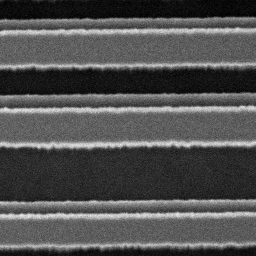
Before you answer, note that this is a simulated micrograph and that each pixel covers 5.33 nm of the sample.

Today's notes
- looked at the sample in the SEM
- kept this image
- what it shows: lines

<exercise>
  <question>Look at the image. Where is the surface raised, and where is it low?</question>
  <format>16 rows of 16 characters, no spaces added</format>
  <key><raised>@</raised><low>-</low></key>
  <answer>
----------------
@@@@@@@@@@@@@@@@
@@@@@@@@@@@@@@@@
@@@@@@@@@@@@@@@@
----------------
----------------
@@@@@@@@@@@@@@@@
@@@@@@@@@@@@@@@@
@@@@@@@@@@@@@@@@
----------------
----------------
----------------
----------------
@@@@@@@@@@@@@@@@
@@@@@@@@@@@@@@@@
----------------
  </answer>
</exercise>